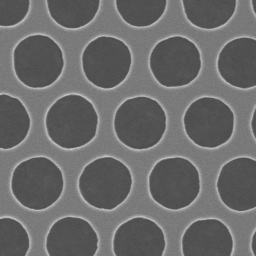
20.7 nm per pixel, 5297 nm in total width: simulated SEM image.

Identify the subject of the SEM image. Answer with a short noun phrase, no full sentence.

a regular array of holes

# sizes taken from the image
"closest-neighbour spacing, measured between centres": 1420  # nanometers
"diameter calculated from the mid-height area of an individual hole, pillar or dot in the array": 1070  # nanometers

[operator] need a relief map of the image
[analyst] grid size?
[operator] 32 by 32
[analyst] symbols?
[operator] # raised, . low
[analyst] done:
....##......###......##......###
....##......###.....###......###
...####....#####....####.....###
#########################..#####
####..##########################
##.....####.....####....####....
##......##......###......###....
##......##......###......##.....
##......##......###......##.....
##.....####.....###......###....
###...######...#####...######...
################################
..#####....#####...######..#####
...###......###.....####.....###
....##......##.......##......###
....##......##.......##......##.
....##......##.......##......###
...####....####.....####....####
.#######.#######...#############
################################
##.....####....#####....####....
##......##......###......##.....
#.......##......###......##.....
#.......##......###......##.....
##.....###......###......##.....
###....####....#####....####....
################################
..#####....#####...######..#####
...###......###.....####....####
....##......##......###......###
....##......##.......##......##.
...###......##......###......###